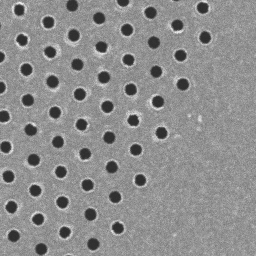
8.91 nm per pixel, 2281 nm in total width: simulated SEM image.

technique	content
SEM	a regular array of holes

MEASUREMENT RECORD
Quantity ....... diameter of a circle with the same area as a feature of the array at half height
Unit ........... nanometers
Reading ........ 113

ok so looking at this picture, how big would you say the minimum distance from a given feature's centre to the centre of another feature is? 261 nanometers